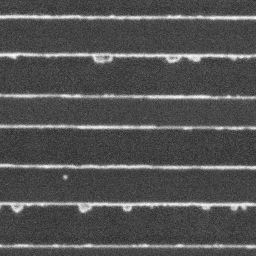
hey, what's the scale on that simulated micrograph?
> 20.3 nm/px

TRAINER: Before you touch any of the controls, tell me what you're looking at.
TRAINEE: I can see lines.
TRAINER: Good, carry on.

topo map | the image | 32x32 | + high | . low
................................
................................
++++++++++++++++++++++++++++++++
++++++++++++++++++++++++++++++++
++++++++++++++++++++++++++++++++
++++++++++++++++++++++++++++++++
++++++++++++++++++++++++++++++++
................................
................................
................................
................................
................................
++++++++++++++++++++++++++++++++
++++++++++++++++++++++++++++++++
++++++++++++++++++++++++++++++++
++++++++++++++++++++++++++++++++
................................
................................
................................
................................
................................
++++++++++++++++++++++++++++++++
++++++++++++++++++++++++++++++++
++++++++++++++++++++++++++++++++
++++++++++++++++++++++++++++++++
...+.+....+++++++++.+.++++++++++
................................
................................
................................
................................
................................
++++++++++++++++++++++++++++++++